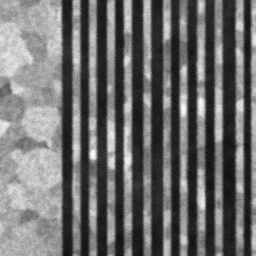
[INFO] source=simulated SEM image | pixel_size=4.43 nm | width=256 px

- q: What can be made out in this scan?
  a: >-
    parallel lines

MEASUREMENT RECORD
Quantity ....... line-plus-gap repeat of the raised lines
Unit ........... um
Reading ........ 0.0803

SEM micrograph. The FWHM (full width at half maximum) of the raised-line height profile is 27.7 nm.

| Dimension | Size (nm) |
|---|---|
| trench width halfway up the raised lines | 51.4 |